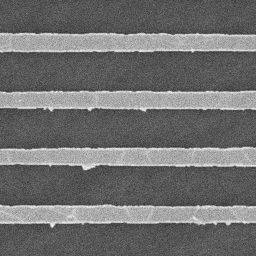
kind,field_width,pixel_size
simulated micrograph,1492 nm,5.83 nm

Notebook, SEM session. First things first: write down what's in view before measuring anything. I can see lines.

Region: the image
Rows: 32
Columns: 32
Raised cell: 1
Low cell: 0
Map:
00000000000000000000000000000000
00000000000000000000000000000000
00000000000000000000000000000000
00000000000000000000000000000000
11111111111111111111111111111111
11111111111111111111111111111111
00000000000000000000000000000000
00000000000000000000000000000000
00000000000000000000000000000000
00000000000000000000000000000000
00000000000000000000000000000000
00000011001011111110011000110011
11111111111111111111111111111111
00111011111111111111111111111111
00000000000000000000000000000000
00000000000000000000000000000000
00000000000000000000000000000000
00000000000000000000000000000000
00000000000000000000000000000010
11111111111111111111111111111111
11111111111111111111111111111111
00000000000000000000000000000000
00000000000000000000000000000000
00000000000000000000000000000000
00000000000000000000000000000000
00000000000000000000000000000000
11111111111111111111111111111111
11111111111111111111111111111111
00000000000000000000000000000000
00000000000000000000000000000000
00000000000000000000000000000000
00000000000000000000000000000000